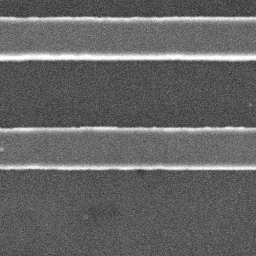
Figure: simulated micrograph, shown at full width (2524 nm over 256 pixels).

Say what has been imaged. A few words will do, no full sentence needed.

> lines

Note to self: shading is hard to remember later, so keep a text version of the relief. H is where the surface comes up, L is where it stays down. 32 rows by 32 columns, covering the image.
LLLLLLLLLLLLLLLLLLLLLLLLLLLLLLLL
LLLLLLLLLLLLLLLLLLLLLLLLLLLLLLLL
HHHHHHHHHHHHHHHHHHHHHHHHHHHHHHHH
HHHHHHHHHHHHHHHHHHHHHHHHHHHHHHHH
HHHHHHHHHHHHHHHHHHHHHHHHHHHHHHHH
HHHHHHHHHHHHHHHHHHHHHHHHHHHHHHHH
HHHHHHHHHHHHHHHHHHHHHHHHHHHHHHHH
LLLLLLLLLLLLLLLLLLLLLLLLLLLLLLLL
LLLLLLLLLLLLLLLLLLLLLLLLLLLLLLLL
LLLLLLLLLLLLLLLLLLLLLLLLLLLLLLLL
LLLLLLLLLLLLLLLLLLLLLLLLLLLLLLLL
LLLLLLLLLLLLLLLLLLLLLLLLLLLLLLLL
LLLLLLLLLLLLLLLLLLLLLLLLLLLLLLLL
LLLLLLLLLLLLLLLLLLLLLLLLLLLLLLLL
LLLLLLLLLLLLLLLLLLLLLLLLLLLLLLLL
LLLLLLLLLLLLLLLLLLLLLLLLLLLLLLLL
HHHHHHHHHHHHHHHHHHHHHHHHHHHHHHHH
HHHHHHHHHHHHHHHHHHHHHHHHHHHHHHHH
HHHHHHHHHHHHHHHHHHHHHHHHHHHHHHHH
HHHHHHHHHHHHHHHHHHHHHHHHHHHHHHHH
HHHHHHHHHHHHHHHHHHHHHHHHHHHHHHHH
LLLLLLLLLLLLLLLLLLLLLLLLLLLLLLLL
LLLLLLLLLLLLLLLLLLLLLLLLLLLLLLLL
LLLLLLLLLLLLLLLLLLLLLLLLLLLLLLLL
LLLLLLLLLLLLLLLLLLLLLLLLLLLLLLLL
LLLLLLLLLLLLLLLLLLLLLLLLLLLLLLLL
LLLLLLLLLLLLLLLLLLLLLLLLLLLLLLLL
LLLLLLLLLLLLLLLLLLLLLLLLLLLLLLLL
LLLLLLLLLLLLLLLLLLLLLLLLLLLLLLLL
LLLLLLLLLLLLLLLLLLLLLLLLLLLLLLLL
LLLLLLLLLLLLLLLLLLLLLLLLLLLLLLLL
LLLLLLLLLLLLLLLLLLLLLLLLLLLLLLLL